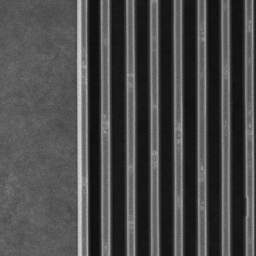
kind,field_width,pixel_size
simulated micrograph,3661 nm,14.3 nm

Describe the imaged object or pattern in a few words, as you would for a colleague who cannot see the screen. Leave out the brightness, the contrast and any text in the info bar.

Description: parallel lines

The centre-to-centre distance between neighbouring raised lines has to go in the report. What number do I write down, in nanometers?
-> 339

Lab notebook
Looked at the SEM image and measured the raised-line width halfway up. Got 136 nm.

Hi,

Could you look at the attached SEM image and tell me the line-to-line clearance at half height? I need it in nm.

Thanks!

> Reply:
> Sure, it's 204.